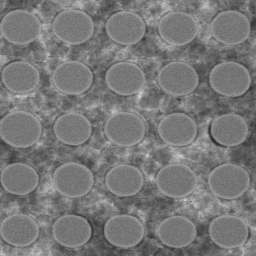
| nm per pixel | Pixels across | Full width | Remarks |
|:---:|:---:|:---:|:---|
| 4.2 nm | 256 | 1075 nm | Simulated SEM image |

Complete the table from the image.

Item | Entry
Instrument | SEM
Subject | a regular array of raised bodies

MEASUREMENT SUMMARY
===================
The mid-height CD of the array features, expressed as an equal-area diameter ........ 150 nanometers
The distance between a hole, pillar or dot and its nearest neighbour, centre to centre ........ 213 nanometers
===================